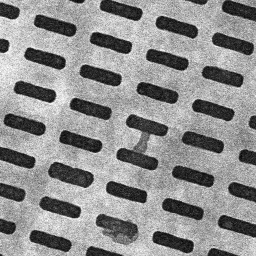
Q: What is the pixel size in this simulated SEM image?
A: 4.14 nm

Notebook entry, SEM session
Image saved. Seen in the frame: a regular array of holes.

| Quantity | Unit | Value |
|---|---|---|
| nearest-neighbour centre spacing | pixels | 34.2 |